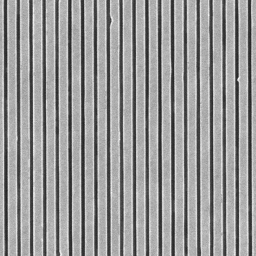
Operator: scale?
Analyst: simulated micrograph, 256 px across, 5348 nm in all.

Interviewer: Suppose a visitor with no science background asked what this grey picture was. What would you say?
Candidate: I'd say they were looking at parallel lines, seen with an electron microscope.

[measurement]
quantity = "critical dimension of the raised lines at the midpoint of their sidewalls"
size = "188 nm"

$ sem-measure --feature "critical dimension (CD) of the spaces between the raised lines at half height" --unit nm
75.7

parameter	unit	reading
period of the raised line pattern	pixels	12.8